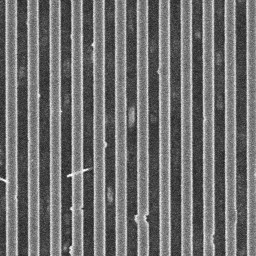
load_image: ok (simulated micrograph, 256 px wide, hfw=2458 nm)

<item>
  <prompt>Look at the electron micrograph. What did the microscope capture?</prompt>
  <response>parallel lines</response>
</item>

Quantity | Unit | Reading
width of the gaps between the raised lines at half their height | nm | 110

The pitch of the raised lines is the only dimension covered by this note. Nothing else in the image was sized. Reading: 210 nm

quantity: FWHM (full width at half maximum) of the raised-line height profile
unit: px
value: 10.5